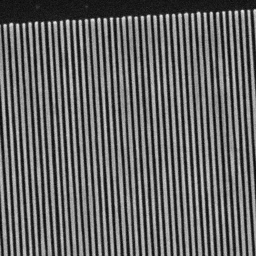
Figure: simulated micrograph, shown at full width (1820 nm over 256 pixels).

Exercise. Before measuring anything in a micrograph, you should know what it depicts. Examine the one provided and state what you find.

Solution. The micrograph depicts parallel lines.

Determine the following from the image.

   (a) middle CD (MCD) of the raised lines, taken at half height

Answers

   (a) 19.5 nm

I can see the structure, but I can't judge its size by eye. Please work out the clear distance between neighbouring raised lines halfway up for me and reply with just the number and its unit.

0.0266 micrometres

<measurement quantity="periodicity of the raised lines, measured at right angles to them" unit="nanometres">44.6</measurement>